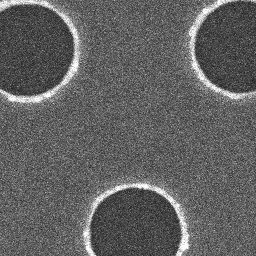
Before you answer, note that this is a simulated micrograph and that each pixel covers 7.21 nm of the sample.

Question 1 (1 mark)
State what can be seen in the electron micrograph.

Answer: holes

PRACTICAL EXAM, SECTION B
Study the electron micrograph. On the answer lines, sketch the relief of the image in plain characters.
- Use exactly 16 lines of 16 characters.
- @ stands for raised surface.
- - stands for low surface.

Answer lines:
---@@@@@@@@@@---
----@@@@@@@@----
-----@@@@@@@----
-----@@@@@@@----
----@@@@@@@@@---
---@@@@@@@@@@@--
@@@@@@@@@@@@@@@@
@@@@@@@@@@@@@@@@
@@@@@@@@@@@@@@@@
@@@@@@@@@@@@@@@@
@@@@@@@@@@@@@@@@
@@@@@@@@@@@@@@@@
@@@@@@----@@@@@@
@@@@@@-----@@@@@
@@@@@@-----@@@@@
@@@@@@-----@@@@@